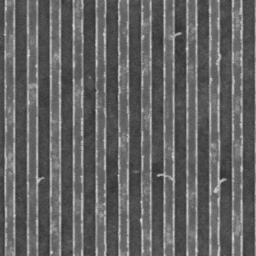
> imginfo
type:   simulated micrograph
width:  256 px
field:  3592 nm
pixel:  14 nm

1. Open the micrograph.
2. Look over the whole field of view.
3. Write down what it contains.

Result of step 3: parallel lines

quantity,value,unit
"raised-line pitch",0.319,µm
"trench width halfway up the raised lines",181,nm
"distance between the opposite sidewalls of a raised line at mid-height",0.14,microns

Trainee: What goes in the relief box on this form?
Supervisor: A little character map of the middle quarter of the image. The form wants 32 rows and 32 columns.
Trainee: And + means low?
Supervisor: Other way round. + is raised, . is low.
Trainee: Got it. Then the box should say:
..+++...++....++...+++...++....+
..+++...++....++...+++...++....+
..+++...++....++...+++...++....+
..+++...++....++...+++...++....+
..+++...++....++...+++...++....+
..+++...++....++...+++...++....+
..+++...++....++...+++...++....+
..+++...++....++...+++...++....+
..+++...++....++...+++...++....+
..+++...++....++...+++...++....+
..+++...++....++...+++...++....+
..+++...++....++...+++...++....+
..+++...++....++...+++...++....+
..+++...++....++...+++...++....+
..+++...++....++...+++...++....+
..+++...++....++...+++...++....+
..+++...++....++...+++...++....+
..+++...++....++...+++...++....+
..+++...++....++...+++...++....+
..+++...++....++...+++...++....+
..+++...++....++...+++...++....+
..+++...++....++...+++...++....+
..+++...++....++...+++...++....+
..+++...++....++...+++...++....+
..+++...++....++...+++...++....+
..+++...++....++...+++...++....+
..+++...++....++...+++...++....+
..+++...++...+++...+++...++....+
..+++...++....++...+++...++....+
..+++...++....++...+++...+++...+
..+++...++....++...+++...++....+
..+++...++....++...+++...++....+